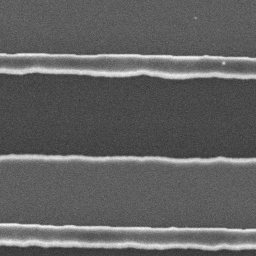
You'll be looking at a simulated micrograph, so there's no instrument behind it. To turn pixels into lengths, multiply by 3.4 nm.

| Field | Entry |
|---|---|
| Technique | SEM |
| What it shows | lines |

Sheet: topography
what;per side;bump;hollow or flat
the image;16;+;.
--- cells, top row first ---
++++++++++++++++
++++++++++++++++
++++++++++++++++
++++++++++++++++
....++++++++++++
................
................
................
................
................
++++++++++++++++
++++++++++++++++
++++++++++++++++
++++++++++++++++
++++++++++++++++
................